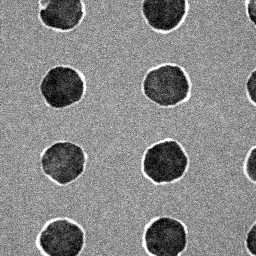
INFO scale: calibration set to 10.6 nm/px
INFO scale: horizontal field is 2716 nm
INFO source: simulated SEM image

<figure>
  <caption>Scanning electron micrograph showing holes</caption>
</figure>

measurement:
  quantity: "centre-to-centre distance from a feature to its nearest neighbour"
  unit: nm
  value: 806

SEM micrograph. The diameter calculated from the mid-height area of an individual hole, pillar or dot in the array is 0.458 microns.